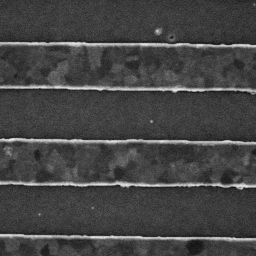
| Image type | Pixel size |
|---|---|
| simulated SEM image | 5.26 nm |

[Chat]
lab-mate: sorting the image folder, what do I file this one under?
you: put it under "lines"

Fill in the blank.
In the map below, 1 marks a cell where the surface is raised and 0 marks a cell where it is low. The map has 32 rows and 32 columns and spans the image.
00000000000000000000000000000000
00000000000000000000000000000000
00000000000000000000000000000000
00000000000000000000000000000000
00000000000000000000000000000000
11111111111111111100000000000000
11111111111111111111111111111111
11111111111111111111111111111111
11111111111111111111111111111111
11111111111111111111111111111111
11111111111111111111111111111111
00000000000000000000000000000000
00000000000000000000000000000000
00000000000000000000000000000000
00000000000000000000000000000000
00000000000000000000000000000000
00000000000000000000000000000000
11111100000000000000000000000000
11111111111111111111111111111111
11111111111111111111111111111111
11111111111111111111111111111111
11111111111111111111111111111111
11111111111111111111111111111111
00000000000000000000000000000000
00000000000000000000000000000000
00000000000000000000000000000000
00000000000000000000000000000000
00000000000000000000000000000000
00000000000000000000000000000000
11111100000000000000000000000000
11111111111111111111111111111111
11111111111111111111111111111111